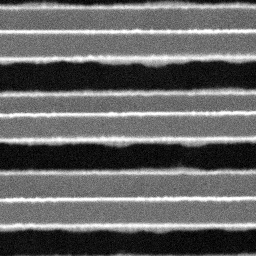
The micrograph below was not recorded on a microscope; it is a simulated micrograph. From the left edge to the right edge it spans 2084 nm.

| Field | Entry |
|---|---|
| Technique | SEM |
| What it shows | lines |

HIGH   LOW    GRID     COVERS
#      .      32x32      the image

................................
################################
################################
################################
################################
################################
################################
................................
................................
................................
................................
................................
################################
################################
################################
################################
################################
##########################..#...
................................
................................
................................
................................
################################
################################
################################
################################
################################
################################
................................
................................
................................
................................